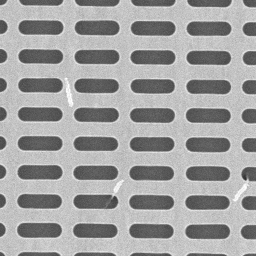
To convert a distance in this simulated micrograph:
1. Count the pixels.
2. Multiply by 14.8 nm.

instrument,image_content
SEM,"groups of lines, slits or small figures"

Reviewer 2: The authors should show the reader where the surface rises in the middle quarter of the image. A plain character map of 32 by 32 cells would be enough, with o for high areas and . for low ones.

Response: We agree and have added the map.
oooooooooooooooooooooooooooooooo
oooooooooooooooooooooooooooooooo
oooooooooooooooooooooooooooooooo
oooooo.ooooooooooooooooooooooooo
ooo...........ooo..........oooo.
oo............oo............ooo.
ooo...........ooo...........ooo.
ooooooo....oooooooo.......oooooo
oooooooooooooooooooooooooooooooo
oooooooooooooooooooooooooooooooo
oooooooooooooooooooooooooooooooo
ooo..........oooo..........oooo.
oo............oo............ooo.
ooo...........ooo...........ooo.
oooo........ooooo..........oooo.
oooooooooooooooooooooooooooooooo
oooooooooooooooooooooooooooooooo
oooooooooooooooooooooooooooooooo
ooo..........oooo..........oooo.
oo............oo............ooo.
oo............oo............ooo.
ooo..........oooo..........oooo.
oooooooooooooooooooooooooooooooo
oooooooooooooooooooooooooooooooo
oooooooooooooooooooooooooooooooo
ooo..........oooo.........oooooo
oo...........ooo...........oooo.
oo............oo............oo..
ooo..........oooo..........oooo.
oooooooooooooooooooooooooooooooo
oooooooooooooooooooooooooooooooo
oooooooooooooooooooooooooooooooo